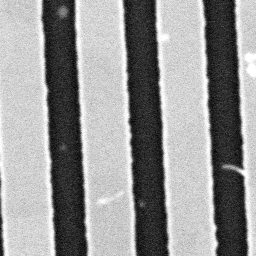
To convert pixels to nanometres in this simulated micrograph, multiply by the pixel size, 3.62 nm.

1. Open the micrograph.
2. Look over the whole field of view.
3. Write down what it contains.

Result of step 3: lines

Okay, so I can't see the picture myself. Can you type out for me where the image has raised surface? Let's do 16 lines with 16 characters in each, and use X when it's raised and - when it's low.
XXX--XXX--XXX--X
XXX--XXX--XXX--X
XXX--XXX--XXX--X
XXX--XXX--XXX--X
XXX--XXX--XXX--X
XXX--XXX--XXX--X
XXX--XXX--XXX--X
XXX--XXX--XXX--X
XXX--XXX--XXX--X
XXX--XXX--XXX--X
XXX--XXX--XXX--X
XXX--XXX--XXX--X
XXX--XXX--XXX--X
XXX--XXX--XXX--X
XXX--XXX---XX---
XXX---XX---XX---